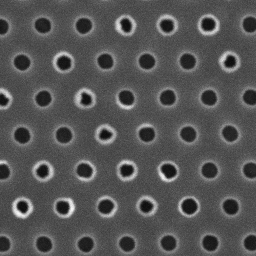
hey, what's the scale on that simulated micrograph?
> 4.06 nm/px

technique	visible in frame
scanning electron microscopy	a regular array of holes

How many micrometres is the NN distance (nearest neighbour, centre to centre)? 0.167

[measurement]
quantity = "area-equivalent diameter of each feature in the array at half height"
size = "0.0668 um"